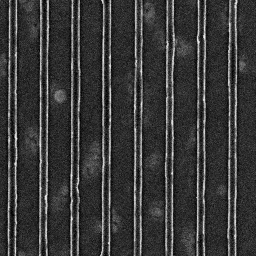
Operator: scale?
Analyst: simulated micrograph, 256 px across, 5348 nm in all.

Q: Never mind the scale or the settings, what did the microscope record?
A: parallel lines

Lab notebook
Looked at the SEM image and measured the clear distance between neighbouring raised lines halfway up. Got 509 nm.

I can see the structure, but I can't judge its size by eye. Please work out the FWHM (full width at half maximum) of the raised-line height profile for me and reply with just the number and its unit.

162 nm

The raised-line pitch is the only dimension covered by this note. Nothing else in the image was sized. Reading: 656 nm